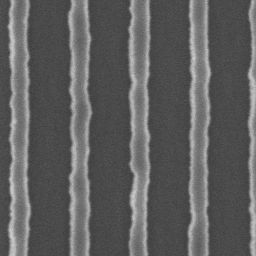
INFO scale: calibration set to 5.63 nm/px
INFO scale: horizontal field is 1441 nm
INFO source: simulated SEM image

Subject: lines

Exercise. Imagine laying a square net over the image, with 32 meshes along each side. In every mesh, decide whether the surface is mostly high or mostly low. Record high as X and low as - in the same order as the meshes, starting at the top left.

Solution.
-XXX-----XX-----XXX-----XX-----X
-XXX-----XX-----XXX-----XX-----X
-XX------XX-----XXX-----XX-----X
-XX------XX-----XXX-----XX-----X
-XX------XX-----XXX-----XX-----X
-XX------XX-----XXX-----XX-----X
-XXX-----XX-----XXX-----XX------
-XXX-----XX-----XXX-----XX-----X
-XX------XX-----XXX-----XX-----X
-XXX-----XX-----XXX-----XX-----X
-XXX-----XX------X------XX-----X
--XX-----XX-----XX------XX-----X
-XXX-----XX-----XXX-----XX-----X
-XXX-----XX-----XXX-----XX-----X
--XX-----XX-----XX------XX-----X
-XXX-----XX-----XX------XX-----X
-XXX-----XX-----XXX-----XX-----X
-XX------XX-----XXX-----XX-----X
--X------XX-----XXX-----XX-----X
--X------XX-----XXX-----XX-----X
-XX------XX-----XXX-----XX-----X
-XX------XX------XX-----XX-----X
-XX------XX------XX-----XX-----X
-XX------XX------X------XX-----X
--XX-----XX-----XX------XX-----X
-XXX-----XX-----XX------XX-----X
-XXX-----XX------X------XX-----X
-XXX-----XX------X------XX------
-XXX-----XX-----XX------XX-----X
-XXX-----XX-----XX------XX------
--X------XX-----XX------XX-----X
-XX------XX-----XX------XX-----X